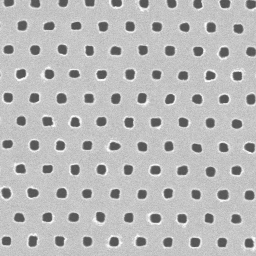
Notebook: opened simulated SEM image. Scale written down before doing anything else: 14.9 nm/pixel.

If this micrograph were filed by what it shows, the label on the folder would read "a regular array of holes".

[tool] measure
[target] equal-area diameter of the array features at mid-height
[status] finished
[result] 143 nm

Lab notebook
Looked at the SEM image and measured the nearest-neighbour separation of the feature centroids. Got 0.395 micrometres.